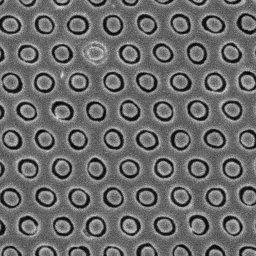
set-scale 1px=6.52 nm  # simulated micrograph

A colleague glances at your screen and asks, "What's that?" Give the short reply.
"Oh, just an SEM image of a regular array of ring-shaped grooves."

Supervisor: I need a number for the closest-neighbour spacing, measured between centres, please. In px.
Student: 31.9